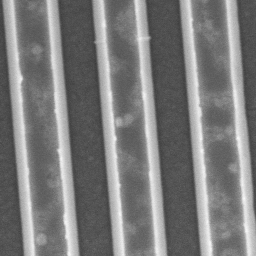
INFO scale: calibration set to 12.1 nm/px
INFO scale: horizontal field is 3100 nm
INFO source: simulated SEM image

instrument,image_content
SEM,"one or a few lines or trenches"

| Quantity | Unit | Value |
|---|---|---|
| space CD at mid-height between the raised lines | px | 45.4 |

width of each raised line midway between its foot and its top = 526 nm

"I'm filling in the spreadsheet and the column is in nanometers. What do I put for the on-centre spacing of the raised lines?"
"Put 1070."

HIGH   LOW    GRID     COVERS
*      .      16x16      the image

.**...***...**..
.**...***...***.
.**...***...***.
.**...***...***.
.***...**...***.
.***...**...***.
.***...**...***.
.***...**...***.
.***...**...***.
.***...***..***.
.***...***...**.
..**...***...**.
..**...***...**.
..**...***...***
..**...***...***
..***..***...***